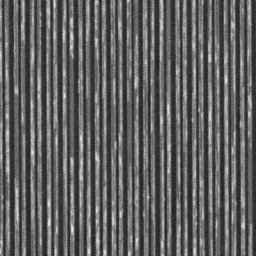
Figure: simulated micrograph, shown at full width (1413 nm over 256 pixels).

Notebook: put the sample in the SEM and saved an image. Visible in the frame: parallel lines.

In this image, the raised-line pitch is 44.6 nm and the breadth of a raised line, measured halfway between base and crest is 0.0186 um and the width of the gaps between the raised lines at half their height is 22.8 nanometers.